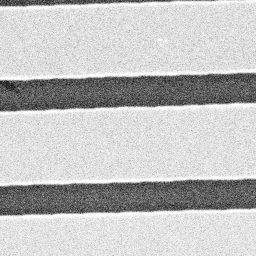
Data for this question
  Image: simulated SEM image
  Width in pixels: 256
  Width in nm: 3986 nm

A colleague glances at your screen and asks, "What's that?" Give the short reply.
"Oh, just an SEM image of lines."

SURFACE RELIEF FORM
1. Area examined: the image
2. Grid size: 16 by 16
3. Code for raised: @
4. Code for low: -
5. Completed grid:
@@@@@@@@@@@@@@@@
@@@@@@@@@@@@@@@@
@@@@@@@@@@@@@@@@
@@@@@@@@@@@@@@@@
@@@@@@@@@@@@@@@-
----------------
----------------
@@@@@@@@@@@@@@@@
@@@@@@@@@@@@@@@@
@@@@@@@@@@@@@@@@
@@@@@@@@@@@@@@@@
@@--------------
----------------
--@@@@@@@@@@@@@@
@@@@@@@@@@@@@@@@
@@@@@@@@@@@@@@@@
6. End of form